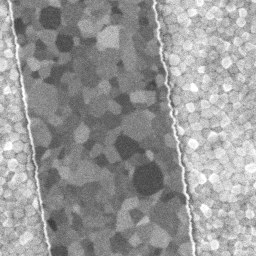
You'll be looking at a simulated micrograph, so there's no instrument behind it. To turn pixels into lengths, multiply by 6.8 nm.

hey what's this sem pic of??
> one or a few lines or trenches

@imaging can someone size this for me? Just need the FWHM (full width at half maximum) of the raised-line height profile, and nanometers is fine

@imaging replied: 980